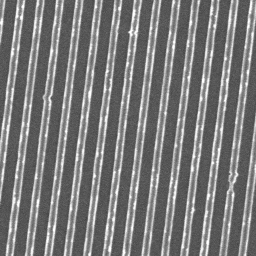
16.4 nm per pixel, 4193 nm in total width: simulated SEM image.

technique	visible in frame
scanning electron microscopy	parallel lines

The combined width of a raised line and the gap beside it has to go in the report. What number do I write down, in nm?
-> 316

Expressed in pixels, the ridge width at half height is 6.7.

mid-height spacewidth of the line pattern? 207 nanometers